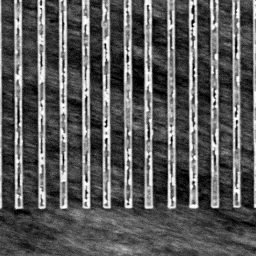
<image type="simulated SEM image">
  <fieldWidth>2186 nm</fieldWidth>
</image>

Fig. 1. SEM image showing parallel lines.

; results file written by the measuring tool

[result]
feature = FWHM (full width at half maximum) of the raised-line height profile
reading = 6.12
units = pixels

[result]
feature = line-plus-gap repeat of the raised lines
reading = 186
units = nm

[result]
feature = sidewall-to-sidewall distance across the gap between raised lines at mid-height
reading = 126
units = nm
